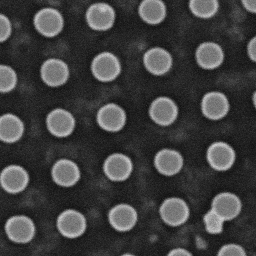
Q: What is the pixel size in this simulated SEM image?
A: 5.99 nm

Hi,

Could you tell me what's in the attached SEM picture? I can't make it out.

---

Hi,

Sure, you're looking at a regular array of raised bodies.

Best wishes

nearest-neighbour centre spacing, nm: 302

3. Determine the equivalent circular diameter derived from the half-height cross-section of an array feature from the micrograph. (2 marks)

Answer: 26.5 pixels